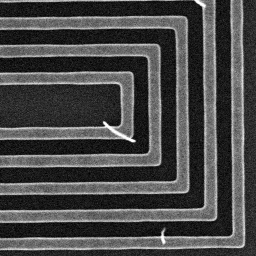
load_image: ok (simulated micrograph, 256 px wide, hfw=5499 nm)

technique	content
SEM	groups of lines, slits or small figures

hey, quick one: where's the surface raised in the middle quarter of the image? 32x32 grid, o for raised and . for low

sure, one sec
.....................ooo....ooo.
.....................ooo....ooo.
ooooooooooooooooo....ooo....ooo.
ooooooooooooooooo....ooo....ooo.
ooooooooooooooooo....ooo....ooo.
..............ooo....ooo....ooo.
..............ooo....ooo....ooo.
..............ooo....ooo....ooo.
..............ooo....ooo....ooo.
..............ooo....ooo....ooo.
..............ooo....ooo....ooo.
...............oo....ooo....ooo.
...............oo....ooo....ooo.
...............oo....ooo....ooo.
..............ooo....ooo....ooo.
..........oo.oooo....ooo....ooo.
ooooooooooooooooo....ooo....ooo.
ooooooooooooooooo....ooo....ooo.
ooooooooooooooooo....ooo....ooo.
.....................ooo....ooo.
.....................ooo....ooo.
.....................ooo....ooo.
.....................ooo....ooo.
oooooooooooooooooooooooo....ooo.
oooooooooooooooooooooooo....ooo.
oooooooooo..................ooo.
............................ooo.
............................ooo.
............................ooo.
....................oooo..ooooo.
ooooooooooooooooooooooooooooooo.
ooooooooooooooooooooooooooooooo.